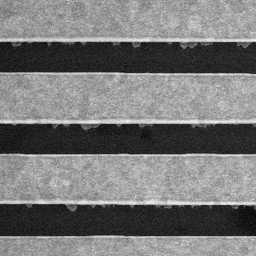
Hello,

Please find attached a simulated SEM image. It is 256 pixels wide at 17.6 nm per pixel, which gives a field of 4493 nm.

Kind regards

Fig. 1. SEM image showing lines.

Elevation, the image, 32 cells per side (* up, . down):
********************************
********************************
********************************
********************************
********************************
................................
................................
................................
................................
********************************
********************************
********************************
********************************
********************************
********************************
................................
................................
................................
................................
********************************
********************************
********************************
********************************
********************************
********************************
...............*****************
................................
................................
................................
................................
********************************
********************************